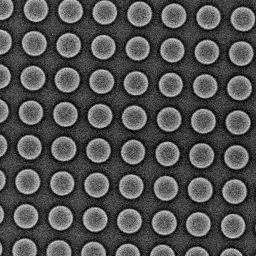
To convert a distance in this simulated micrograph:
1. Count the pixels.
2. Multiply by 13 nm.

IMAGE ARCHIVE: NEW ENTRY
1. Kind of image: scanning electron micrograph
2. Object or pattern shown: an array of small figures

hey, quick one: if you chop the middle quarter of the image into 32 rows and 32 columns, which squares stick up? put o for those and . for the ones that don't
................................
oo..............................
ooo....ooooo....oooo......oo....
oooo...ooooo...oooooo...ooooo...
oooo...ooooo...oooooo...ooooo...
ooo....ooooo...oooooo...ooooo...
oo.....oooo.....oooo....ooooo...
.................oo......ooo....
................................
................................
oo......oo......................
ooo....ooooo...ooooo.....ooo....
ooo...oooooo...ooooo....ooooo...
ooo...oooooo...ooooo...oooooo...
ooo...oooooo...ooooo...oooooo...
........ooo....ooooo....ooooo...
.........................oo.....
................................
o...............................
oo.....oooo.....ooo.............
ooo...ooooo....ooooo....oooo....
ooo...ooooo...oooooo...oooooo...
ooo...ooooo...oooooo...oooooo...
oo....ooooo....ooooo...oooooo...
................ooo.....oooo....
................................
................................
o......oo.......................
oo....ooooo....oooo.....ooo.....
oo...oooooo...ooooo....ooooo....
oo...oooooo...oooooo...ooooo...o
oo....ooooo...oooooo...ooooo...o